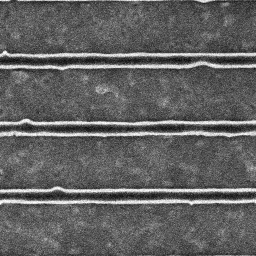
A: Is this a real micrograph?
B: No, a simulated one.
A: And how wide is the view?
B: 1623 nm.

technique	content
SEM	one or a few lines or trenches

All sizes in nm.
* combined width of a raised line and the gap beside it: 430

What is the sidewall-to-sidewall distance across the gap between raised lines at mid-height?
346 nm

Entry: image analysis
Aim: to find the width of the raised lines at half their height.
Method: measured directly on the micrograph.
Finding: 80.9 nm